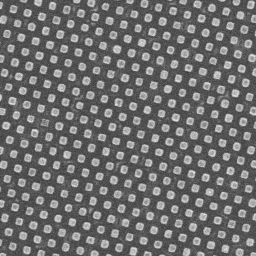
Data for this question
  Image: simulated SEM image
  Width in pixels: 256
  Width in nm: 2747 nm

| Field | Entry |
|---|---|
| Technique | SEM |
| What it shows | a regular array of raised bodies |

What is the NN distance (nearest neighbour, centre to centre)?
0.156 micrometres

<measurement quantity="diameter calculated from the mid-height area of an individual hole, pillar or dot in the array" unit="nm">79.4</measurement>